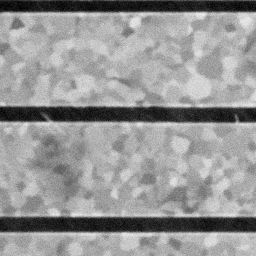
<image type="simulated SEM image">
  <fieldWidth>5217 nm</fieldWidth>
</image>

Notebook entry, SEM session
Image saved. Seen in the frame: lines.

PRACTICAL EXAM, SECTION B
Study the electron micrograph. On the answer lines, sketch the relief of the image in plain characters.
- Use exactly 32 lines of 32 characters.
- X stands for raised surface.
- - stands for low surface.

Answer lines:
--------------------------------
--------------------------------
XXXXXXXXXXXXXXXXXXXXXXXXXXXXXXXX
XXXXXXXXXXXXXXXXXXXXXXXXXXXXXXXX
XXXXXXXXXXXXXXXXXXXXXXXXXXXXXXXX
XXXXXXXXXXXXXXXXXXXXXXXXXXXXXXXX
XXXXXXXXXXXXXXXXXXXXXXXXXXXXXXXX
XXXXXXXXXXXXXXXXXXXXXXXXXXXXXXXX
XXXXXXXXXXXXXXXXXXXXXXXXXXXXXXXX
XXXXXXXXXXXXXXXXXXXXXXXXXXXXXXXX
XXXXXXXXXXXXXXXXXXXXXXXXXXXXXXXX
XXXXXXXXXXXXXXXXXXXXXXXXXXXXXXXX
XXXXXXXXXXXXXXXXXXXXXXXXXXXXXXXX
--------------------------------
--------------------------------
XXXXXXXXXXXXXXXXXXXXXXXXXXXXXXXX
XXXXXXXXXXXXXXXXXXXXXXXXXXXXXXXX
XXXXXXXXXXXXXXXXXXXXXXXXXXXXXXXX
XXXXXXXXXXXXXXXXXXXXXXXXXXXXXXXX
XXXXXXXXXXXXXXXXXXXXXXXXXXXXXXXX
XXXXXXXXXXXXXXXXXXXXXXXXXXXXXXXX
XXXXXXXXXXXXXXXXXXXXXXXXXXXXXXXX
XXXXXXXXXXXXXXXXXXXXXXXXXXXXXXXX
XXXXXXXXXXXXXXXXXXXXXXXXXXXXXXXX
XXXXXXXXXXXXXXXXXXXXXXXXXXXXXXXX
XXXXXXXXXXXXXXXXXXXXXXXXXXXXXXXX
XXXXXXXXXXXXXXXXXXXXXXXXXXXXXXXX
--------------------------------
--------------------------------
XXXXXXXXXXXXXXXXXXXXXXXXXXXXXXXX
XXXXXXXXXXXXXXXXXXXXXXXXXXXXXXXX
XXXXXXXXXXXXXXXXXXXXXXXXXXXXXXXX